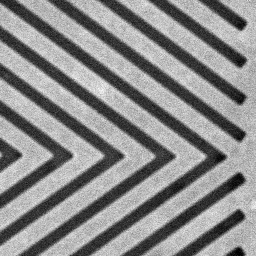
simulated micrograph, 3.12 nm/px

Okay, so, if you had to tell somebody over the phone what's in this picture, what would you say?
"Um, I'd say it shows groups of lines, slits or small figures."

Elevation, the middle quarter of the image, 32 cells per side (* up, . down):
*****......*******.....*******..
******......*******......******.
.*******.....*******......******
..*******......*******.....*****
...*******......*******......***
.....*******.....*******......**
*.....*******......*******.....*
**.....*******......*******.....
***......*******.....*******....
*****.....*******......*******..
******.....*******......*******.
*******......*******.....*******
..*******.....*******......*****
...*******.....*******......****
....*******......*******......**
......*******.....*******......*
*......*******.....********.....
***.....*******......*******....
****......*******.....*******...
*****......*******......*******.
*******.....*******......*******
.*******......*******.....******
..*******......*******......****
..********.....*******......****
.*******......*******......*****
*******......*******.....*******
*****......*******......*******.
****......*******.....********..
***.....********.....*******....
*......*******......*******.....
.....********.....*******......*
....*******......*******......**